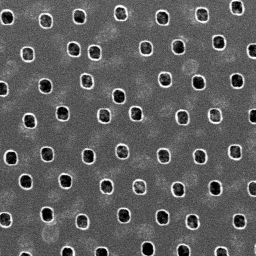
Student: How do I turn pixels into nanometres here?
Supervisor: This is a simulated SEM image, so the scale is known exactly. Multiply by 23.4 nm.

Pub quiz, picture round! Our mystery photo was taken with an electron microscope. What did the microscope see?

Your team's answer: a regular array of holes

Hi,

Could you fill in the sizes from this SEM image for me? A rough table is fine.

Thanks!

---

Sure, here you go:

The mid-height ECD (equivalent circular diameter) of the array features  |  314 nm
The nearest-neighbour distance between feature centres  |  772 nanometers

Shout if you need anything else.